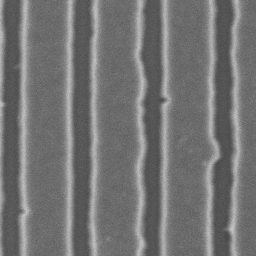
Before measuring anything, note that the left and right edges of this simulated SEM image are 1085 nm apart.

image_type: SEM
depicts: one or a few lines or trenches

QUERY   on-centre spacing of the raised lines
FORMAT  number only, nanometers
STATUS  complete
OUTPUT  300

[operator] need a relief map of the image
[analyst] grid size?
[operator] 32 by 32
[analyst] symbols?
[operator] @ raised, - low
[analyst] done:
---@@@@@@---@@@@@@--@@@@@@@--@@@
---@@@@@@---@@@@@@--@@@@@@@--@@@
---@@@@@@---@@@@@@--@@@@@@@--@@@
---@@@@@@---@@@@@@---@@@@@@--@@@
---@@@@@@---@@@@@@---@@@@@@--@@@
---@@@@@@---@@@@@@---@@@@@@--@@@
---@@@@@@---@@@@@---@@@@@@@--@@@
---@@@@@@---@@@@@----@@@@@@--@@@
---@@@@@@---@@@@@@---@@@@@@--@@@
---@@@@@@---@@@@@@---@@@@@@--@@@
---@@@@@@---@@@@@@---@@@@@@--@@@
---@@@@@@---@@@@@@--@@@@@@@--@@@
---@@@@@@--@@@@@@@---@@@@@@--@@@
---@@@@@@--@@@@@@@--@@@@@@@--@@@
---@@@@@@---@@@@@@--@@@@@@@--@@@
---@@@@@@---@@@@@@--@@@@@@@--@@@
---@@@@@@---@@@@@@--@@@@@@@--@@@
---@@@@@@---@@@@@@--@@@@@@@--@@@
---@@@@@@---@@@@@@--@@@@@@@---@@
---@@@@@@---@@@@@@--@@@@@@@--@@@
---@@@@@@---@@@@@@--@@@@@@@--@@@
---@@@@@@---@@@@@@--@@@@@@---@@@
---@@@@@@---@@@@@@--@@@@@@---@@@
---@@@@@@---@@@@@@--@@@@@@---@@@
---@@@@@@---@@@@@@--@@@@@@---@@@
---@@@@@@--@@@@@@@--@@@@@@---@@@
---@@@@@@--@@@@@@@--@@@@@@---@@@
---@@@@@@--@@@@@@@--@@@@@@---@@@
---@@@@@@--@@@@@@---@@@@@@---@@@
---@@@@@@---@@@@@@--@@@@@@---@@@
---@@@@@@--@@@@@@@--@@@@@@---@@@
---@@@@@@---@@@@@@--@@@@@@---@@@